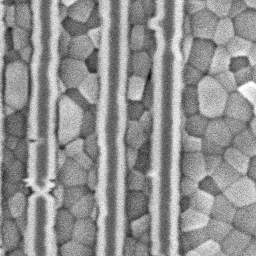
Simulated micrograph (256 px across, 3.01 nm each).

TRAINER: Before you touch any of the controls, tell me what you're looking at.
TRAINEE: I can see one or a few lines or trenches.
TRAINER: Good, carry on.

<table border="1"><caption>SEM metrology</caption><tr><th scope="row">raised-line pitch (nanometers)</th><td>186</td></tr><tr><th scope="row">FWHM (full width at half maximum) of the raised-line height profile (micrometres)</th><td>0.0579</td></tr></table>